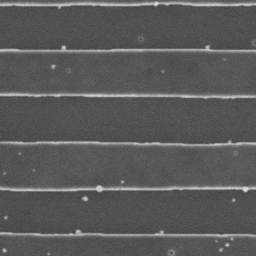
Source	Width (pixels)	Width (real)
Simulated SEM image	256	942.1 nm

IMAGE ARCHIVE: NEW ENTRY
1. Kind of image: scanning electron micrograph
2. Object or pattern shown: lines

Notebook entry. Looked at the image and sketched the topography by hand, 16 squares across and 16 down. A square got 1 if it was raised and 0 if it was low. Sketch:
0000000000000000
0000000000000000
0000000000000000
1111111111111111
1111111111111111
1111111111111111
0000000000000000
0000000000000000
0000000000000000
1111111111111111
1111111111111111
1111111111111111
0000000000000000
0000000000000000
0000000000000000
1111111111111111